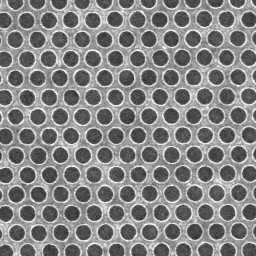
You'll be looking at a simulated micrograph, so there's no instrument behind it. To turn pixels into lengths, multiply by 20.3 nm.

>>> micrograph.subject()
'a regular array of holes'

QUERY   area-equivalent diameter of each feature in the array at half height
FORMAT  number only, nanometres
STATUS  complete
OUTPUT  334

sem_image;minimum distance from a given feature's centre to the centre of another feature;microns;0.445